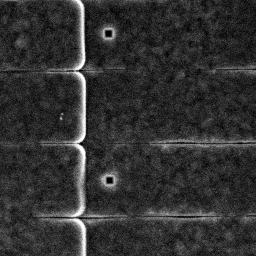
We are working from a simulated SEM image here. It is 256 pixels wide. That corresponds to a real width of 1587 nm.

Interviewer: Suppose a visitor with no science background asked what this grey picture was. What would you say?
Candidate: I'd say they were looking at wiring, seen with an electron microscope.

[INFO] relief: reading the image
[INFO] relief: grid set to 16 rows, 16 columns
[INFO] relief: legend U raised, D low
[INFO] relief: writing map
UUUUUDDDDDDDDDDD
UUUUUDDDDDDDDDDD
UUUUUDDDDDDDDDDD
UUUUUDDDDDDDDDDD
UUUUUDDDDDDDDDDD
UUUUUDDDDDDDDDDD
UUUUUDDDDDDDDDDD
UUUUUDDDDDDDDDDD
UUUUUDDDDDDDDDDD
UUUUUDDDDDDDDDDD
UUUUUDDDDDDDDDDD
UUUUUDDDDDDDDDDD
UUUUUDDDDDDDDDDD
UUUUUDDDDDDDDDDD
UUUUUDDDDDDDDDDD
UUUUUDDDDDDDDDDD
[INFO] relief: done